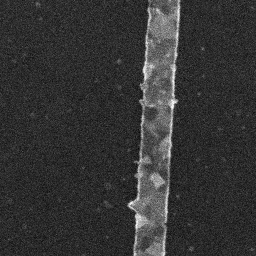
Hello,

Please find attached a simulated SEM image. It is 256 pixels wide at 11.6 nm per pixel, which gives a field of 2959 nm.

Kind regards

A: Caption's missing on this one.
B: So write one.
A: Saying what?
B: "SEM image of one or a few lines or trenches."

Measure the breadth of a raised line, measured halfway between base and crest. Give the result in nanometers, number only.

340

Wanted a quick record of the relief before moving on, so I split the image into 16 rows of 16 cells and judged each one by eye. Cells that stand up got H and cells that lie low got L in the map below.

LLLLLLLLLHHLLLLL
LLLLLLLLLHHLLLLL
LLLLLLLLLHHLLLLL
LLLLLLLLLHHLLLLL
LLLLLLLLLHHLLLLL
LLLLLLLLLHHLLLLL
LLLLLLLLLHHLLLLL
LLLLLLLLLHHLLLLL
LLLLLLLLLHHLLLLL
LLLLLLLLLHHLLLLL
LLLLLLLLLHHLLLLL
LLLLLLLLLHHLLLLL
LLLLLLLLHHLLLLLL
LLLLLLLLHHLLLLLL
LLLLLLLLLHLLLLLL
LLLLLLLLHHLLLLLL